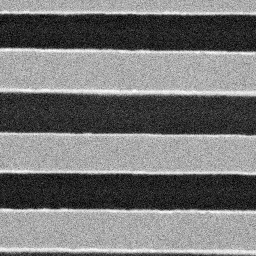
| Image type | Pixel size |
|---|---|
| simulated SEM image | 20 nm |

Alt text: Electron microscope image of lines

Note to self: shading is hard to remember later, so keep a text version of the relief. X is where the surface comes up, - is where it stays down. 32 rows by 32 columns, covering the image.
XXXXXXXXXXXXXXXXXXXXXXXXXXXXXXXX
XXXXXXXXXXXXXXXXXXXXXXXXXXXXXXXX
--------------------------------
--------------------------------
--------------------------------
--------------------------------
XXXXXXXXXXXXXXXXXXXX------------
XXXXXXXXXXXXXXXXXXXXXXXXXXXXXXXX
XXXXXXXXXXXXXXXXXXXXXXXXXXXXXXXX
XXXXXXXXXXXXXXXXXXXXXXXXXXXXXXXX
XXXXXXXXXXXXXXXXXXXXXXXXXXXXXXXX
----------------------XXXXXXXXXX
--------------------------------
--------------------------------
--------------------------------
--------------------------------
--------------------------------
XXXXXXXXXXXXXXXXXXXXXXXXXXXXXXXX
XXXXXXXXXXXXXXXXXXXXXXXXXXXXXXXX
XXXXXXXXXXXXXXXXXXXXXXXXXXXXXXXX
XXXXXXXXXXXXXXXXXXXXXXXXXXXXXXXX
---------------XXXXXXXXXXXXXXXXX
--------------------------------
--------------------------------
--------------------------------
--------------------------------
XXXXXXXXXXXXXXXXXXXXXXXXXXXXXXXX
XXXXXXXXXXXXXXXXXXXXXXXXXXXXXXXX
XXXXXXXXXXXXXXXXXXXXXXXXXXXXXXXX
XXXXXXXXXXXXXXXXXXXXXXXXXXXXXXXX
XXXXXXXXXXXXXXXXXXXXXXXXXXXXXXXX
--------------------------------